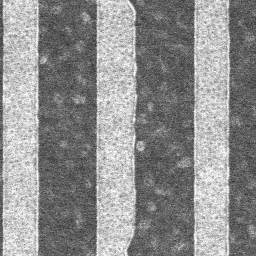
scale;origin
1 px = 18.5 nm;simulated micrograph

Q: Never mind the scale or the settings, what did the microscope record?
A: one or a few lines or trenches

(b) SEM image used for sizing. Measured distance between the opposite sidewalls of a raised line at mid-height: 620 nm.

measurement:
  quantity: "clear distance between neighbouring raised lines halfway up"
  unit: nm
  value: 1120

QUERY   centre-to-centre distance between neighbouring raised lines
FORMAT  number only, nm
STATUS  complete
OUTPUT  1770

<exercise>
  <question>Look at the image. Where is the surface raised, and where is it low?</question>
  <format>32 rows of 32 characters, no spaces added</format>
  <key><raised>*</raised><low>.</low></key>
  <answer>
.****.......****.........***....
*****.......*****.......****....
*****.......*****........***....
.****.......*****.......****....
.****.......*****.......*****...
.****.......*****.......*****...
.****.......*****.......****....
.****.......*****.......*****...
.****.......*****.......*****...
.****.......*****........***....
.****.......*****........***....
.****.......*****.......****....
.****.......*****........***....
.****.......*****.......****....
.***........*****.......****....
.****.......*****.......****....
.****.......*****.......****....
.****.......*****.......****....
.****.......*****.......****....
.****.......*****.......****....
.****.......*****.......****....
.****.......*****.......****....
.****.......*****........***....
.****.......*****.......****....
.****.......*****.......****....
.****.......*****.......****....
.****.......*****.......****....
*****.......*****........***....
*****.......*****........***....
.****.......****........****....
.****.......****.........***....
.****.......****.........***....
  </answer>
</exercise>